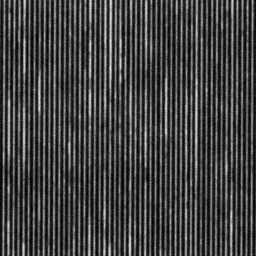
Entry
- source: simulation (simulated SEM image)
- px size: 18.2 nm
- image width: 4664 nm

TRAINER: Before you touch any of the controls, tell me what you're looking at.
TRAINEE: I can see parallel lines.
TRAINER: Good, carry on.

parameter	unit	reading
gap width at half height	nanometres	77.4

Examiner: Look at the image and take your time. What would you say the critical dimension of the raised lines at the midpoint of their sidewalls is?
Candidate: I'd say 15.9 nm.